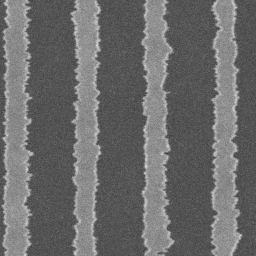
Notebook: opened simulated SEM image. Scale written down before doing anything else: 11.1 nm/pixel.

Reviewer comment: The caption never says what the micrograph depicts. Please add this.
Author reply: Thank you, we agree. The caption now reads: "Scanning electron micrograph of one or a few lines or trenches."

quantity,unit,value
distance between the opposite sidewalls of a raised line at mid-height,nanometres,218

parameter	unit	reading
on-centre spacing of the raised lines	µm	0.769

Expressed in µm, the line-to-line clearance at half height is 0.546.